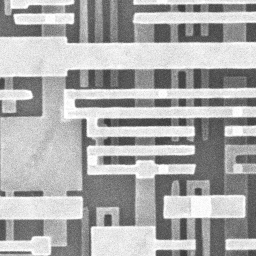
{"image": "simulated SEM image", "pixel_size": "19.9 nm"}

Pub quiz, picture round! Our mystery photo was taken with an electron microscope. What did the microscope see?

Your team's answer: wiring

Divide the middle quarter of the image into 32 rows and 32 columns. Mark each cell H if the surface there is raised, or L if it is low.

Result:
HHHHHHHHHHHHHHHHHHHHHHHHHHHHHHHH
HLLLLLLLLLLLLLLLLLLLLLLLLLLLLLLL
HLLLLLLLLLLLLLLLLLLLLLLLLLLLLLLL
LLLLLLLLLLLLLLLLLLLLLLLLLLLLLLLL
LLLLLLLLLLLLLLLLLLLLLLLLLLLLLLLL
LLLLLLLLLLLLLLLLLLLLLLLLLLLLLLLL
LLHLLLLLLLLLLLLLHHHLHHHHHHHHHHHH
HHHHHHHHHHHHHHHHHHHHHHHHHHHHHHHH
HHHHHHHHHHHHHHHHLHHHHHHHHHHHHHLL
HHHLLLLLLLLLLLLLLLLLLLLLLLLLLLLL
HHHLLLLLLLLLLLLLLLLLLLLLLLLLLLLL
HHHHHHHHHHHHHHHHHHHHHHHHHHHHHHHH
HHHHHHHHHHHHHHHHHHHHHHHHHHHHHHHH
LLLLLHHHHLLLLLLLLLLLLLLLLLLLLLLL
LLLLLLHHLLLLLLLLLLLLLLLLLLLLLLLL
LLLLLLHHLLLLLLLLLLLLLLLLLLLLLLLL
LLLLLLHHHHHHHHHHHHHHHHHHHHHHHHHH
LLLLLLHHHHHHHHHHHHHHHHHHHHHHHHHH
LLLLLLLLLLLLLLLLLLLLLLLLLLLLLLLL
LLLLLLLLLLLLLLLLLLLLLLLLLLLLLLLL
LLLLLLLLLLLLLLLLLLLLLLLLLLLLLLLL
LLLLLLHHHHHHHHHHHHHHHHHHHHHHHHHH
LLLLLLHHHHHHHHHHHHHHHHHHHHHHHHHH
LLLLLLHHLLLLLLLLLLLLLLLLLLLLLLLL
LLLLLLHHLLLLLLLLLLHHHHLLLLLLLLLL
LLLLLLHHHHHHHHHHHHHHHHHHHHHHHHHH
LLLLLLHHHHHHHHHHHHHHHHHHHHHHHHHH
LLLLLLLLLLLLLLLLLLHHHHHLLLLLLLLL
LLLLLLLLLLLLLLLLLLLLLLLLLLLLLLLL
LLLLLLLLLLLLLLLLLLLLLLLLLLLLLLLL
LLLLLLLLLLLLLLLLLLLLLLLLLLLLLLLL
LLLLLLLLLLLLLLLLLLLLLLLLLLLLLLLL